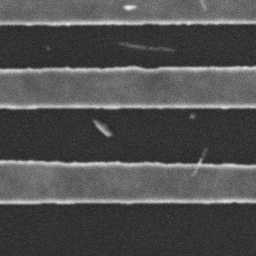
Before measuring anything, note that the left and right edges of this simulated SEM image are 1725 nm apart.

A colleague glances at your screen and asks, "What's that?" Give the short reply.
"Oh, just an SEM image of lines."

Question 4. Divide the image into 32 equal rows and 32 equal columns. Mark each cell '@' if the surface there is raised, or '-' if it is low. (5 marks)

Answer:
@@@@@@@@@@@@@@@@@@@@@@@@@@@@@@@@
@@@@@@@@@@@@@@@@@@@@@@@@@@@@@@@@
@@@@@@@@@@@@@@@@@@@@@@@@@@@@@@@@
--------------------------------
--------------------------------
--------------------------------
--------------------------------
--------------------------------
--------@-----@@@@--@@@@@@@@@@@@
@@@@@@@@@@@@@@@@@@@@@@@@@@@@@@@@
@@@@@@@@@@@@@@@@@@@@@@@@@@@@@@@@
@@@@@@@@@@@@@@@@@@@@@@@@@@@@@@@@
@@@@@@@@@@@@@@@@@@@@@@@@@@@@@@@@
-@@@@-------@@@---@-@------@@---
--------------------------------
--------------------------------
--------------------------------
--------------------------------
--------------------------------
--------------------------------
@@@@@@@@@@@@@@@@@@@@@-@-@@------
@@@@@@@@@@@@@@@@@@@@@@@@@@@@@@@@
@@@@@@@@@@@@@@@@@@@@@@@@@@@@@@@@
@@@@@@@@@@@@@@@@@@@@@@@@@@@@@@@@
@@@@@@@@@@@@@@@@@@@@@@@@@@@@@@@@
--------------------------------
--------------------------------
--------------------------------
--------------------------------
--------------------------------
--------------------------------
--------------------------------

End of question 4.